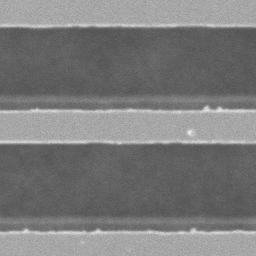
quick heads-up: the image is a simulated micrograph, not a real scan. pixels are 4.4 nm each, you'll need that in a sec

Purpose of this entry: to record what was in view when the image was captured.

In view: lines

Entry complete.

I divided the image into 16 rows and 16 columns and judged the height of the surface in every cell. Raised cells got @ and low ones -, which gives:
@@@@@@@@@@@@@@@@
@@@@@@@@@@@@@@@@
----------------
----------------
----------------
----------------
@@@@@@@@@@@@@@@@
@@@@@@@@@@@@@@@@
@@@@@@@@@@@@@@@@
----------------
----------------
----------------
----------------
----------------
@@@@@@@@@@@@@@@@
@@@@@@@@@@@@@@@@